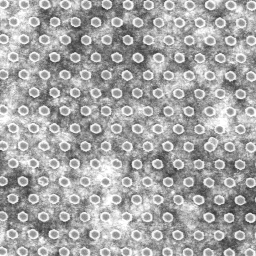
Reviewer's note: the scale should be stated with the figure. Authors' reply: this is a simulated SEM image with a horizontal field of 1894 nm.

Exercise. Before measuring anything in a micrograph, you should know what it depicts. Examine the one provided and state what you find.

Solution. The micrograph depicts a regular array of raised bodies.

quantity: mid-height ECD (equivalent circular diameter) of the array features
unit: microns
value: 0.0691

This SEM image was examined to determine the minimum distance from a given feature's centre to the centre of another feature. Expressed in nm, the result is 148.